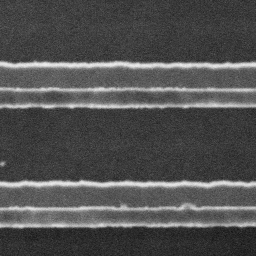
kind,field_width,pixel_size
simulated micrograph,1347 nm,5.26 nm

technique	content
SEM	lines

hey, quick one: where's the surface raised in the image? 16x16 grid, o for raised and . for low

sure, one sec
................
................
................
................
oooooooooooooooo
oooooooooooooooo
oooooooooooooooo
................
................
................
................
.o.ooo.oo..o.oo.
oooooooooooooooo
oooooooooooooooo
................
................